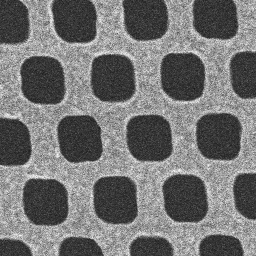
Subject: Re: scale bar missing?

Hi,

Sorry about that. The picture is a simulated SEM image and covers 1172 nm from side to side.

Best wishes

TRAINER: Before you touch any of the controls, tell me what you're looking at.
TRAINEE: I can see a regular array of holes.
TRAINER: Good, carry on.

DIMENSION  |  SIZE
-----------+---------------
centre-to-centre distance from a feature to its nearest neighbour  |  319 nm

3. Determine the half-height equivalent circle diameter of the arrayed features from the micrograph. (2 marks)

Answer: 224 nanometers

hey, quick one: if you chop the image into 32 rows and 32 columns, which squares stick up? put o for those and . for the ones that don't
...oooo.....ooo......ooo.....ooo
....ooo.....ooo......ooo......oo
....ooo.....ooo......ooo......oo
....ooo.....oooo.....ooo......oo
....ooo.....oooo....ooooo....ooo
o.oooooooooooooooooooooooooooooo
oooooooooooooooooooooooooooooo..
ooo....ooooo....oooo.....oooo...
ooo.....ooo......ooo......ooo...
ooo.....ooo......ooo......ooo...
ooo.....ooo......ooo......ooo...
ooo.....ooo......oooo....oooo...
oooo....oooo....oooooo..oooooooo
oooooooooooooooooooooooooooooooo
oooooooo...oooooo...ooooo....ooo
...oooo.....oooo.....oooo.....oo
....ooo......ooo.....ooo......oo
....ooo......ooo.....oooo.....oo
....ooo......ooo......ooo.....oo
....oooo.....oooo....oooo.....oo
...ooooooooooooooooooooooooooooo
oooooooooooooooooooooooooooooooo
oooo...ooooo.....oooo....oooo...
ooo.....oooo.....ooo......ooo...
ooo......ooo.....ooo......ooo...
ooo......ooo.....oooo.....ooo...
ooo......ooo.....oooo.....oooo..
oooo....ooooo....ooooo...ooooooo
oooooooooooooooooooooooooooooooo
oooooooooooooooooooooooooo...ooo
...ooooo....oooo.....oooo.....oo
....ooo......ooo......ooo.....oo